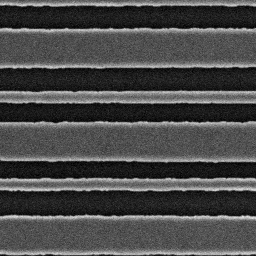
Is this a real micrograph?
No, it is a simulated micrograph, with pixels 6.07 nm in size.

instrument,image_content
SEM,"lines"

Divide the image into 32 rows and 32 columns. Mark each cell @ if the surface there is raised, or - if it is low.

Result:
@@@@@@@@@@@@@@@@@@@@@@@@@@@@@@@@
--------------------------------
--------------------------------
--------------------------------
@@@@@@@@@@@@@@@@@@@@@@@@@@@@@@@@
@@@@@@@@@@@@@@@@@@@@@@@@@@@@@@@@
@@@@@@@@@@@@@@@@@@@@@@@@@@@@@@@@
@@@@@@@@@@@@@@@@@@@@@@@@@@@@@@@@
--------------------------------
--------------------------------
--------------------------------
@@@@-@@@@@@@@@@@@@@@@@@@@@@@@@@@
@@@@@@@@@@@@@@@@@@@@@@@@@@@@@@@@
--------------------------------
--------------------------------
@@@@@@@@@@@@@@@@@@@@@@@@@@@@@@@@
@@@@@@@@@@@@@@@@@@@@@@@@@@@@@@@@
@@@@@@@@@@@@@@@@@@@@@@@@@@@@@@@@
@@@@@@@@@@@@@@@@@@@@@@@@@@@@@@@@
@@@@@@@@@@@@@@@@@@@@@@@@@@@@@@@@
--------------------------------
--------------------------------
@@@@@@@@@@@@@@@@@@@@@@@@@@@@@@@@
@@@@@@@@@@@@@@@@@@@@@@@@@@@@@@@@
--------------------------------
--------------------------------
--------------------------------
@@@@@@@@@@@@@@@@@@@@@@@@@@@@@@@@
@@@@@@@@@@@@@@@@@@@@@@@@@@@@@@@@
@@@@@@@@@@@@@@@@@@@@@@@@@@@@@@@@
@@@@@@@@@@@@@@@@@@@@@@@@@@@@@@@@
@@@@@@@@@@@@@@@@@@@@@@@@@@@@@@@@